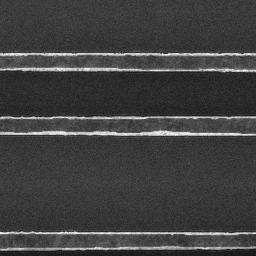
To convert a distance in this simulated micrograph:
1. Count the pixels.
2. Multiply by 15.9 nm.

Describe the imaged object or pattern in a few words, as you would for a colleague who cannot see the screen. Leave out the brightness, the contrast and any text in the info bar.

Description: lines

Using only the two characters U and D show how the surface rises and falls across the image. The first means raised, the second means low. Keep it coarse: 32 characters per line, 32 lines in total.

DDDDDDDDDDDDDDDDDDDDDDDDDDDDDDDD
DDDDDDDDDDDDDDDDDDDDDDDDDDDDDDDD
DDDDDDDDDDDDDDDDDDDDDDDDDDDDDDDD
DDDDDDDDDDDDDDDDDDDDDDDDDDDDDDDD
DDDDDDDDDDDDDDDDDDDDDDDDDDDDDDDD
DDDDDDDDDDDDDDDDDDDDDDDDDDDDDDDD
DDDDDDDDDDDDDDDDDDDDDDDDDDDDDDDD
UUUUUUUUUUUUUUUUUUUUUUUUUUUUUUUU
UUUUUUUUUUUUUUUUUUUUUUUUUUUUUUUU
DDDDDDDDDDDDDDDDDDDDDDDDDDDDDDDD
DDDDDDDDDDDDDDDDDDDDDDDDDDDDDDDD
DDDDDDDDDDDDDDDDDDDDDDDDDDDDDDDD
DDDDDDDDDDDDDDDDDDDDDDDDDDDDDDDD
DDDDDDDDDDDDDDDDDDDDDDDDDDDDDDDD
DDDDDDDDDDDDDDDDDDDDDDDDDDDDDDDD
UUUUUUUUUUUUUUUUUUUUUUUUUUUUUUUU
UUUUUUUUUUUUUUUUUUUUUUUUUUUUUUUU
DDDDDDDDDDDDDDDDDDDDDDDDDDDDDDDD
DDDDDDDDDDDDDDDDDDDDDDDDDDDDDDDD
DDDDDDDDDDDDDDDDDDDDDDDDDDDDDDDD
DDDDDDDDDDDDDDDDDDDDDDDDDDDDDDDD
DDDDDDDDDDDDDDDDDDDDDDDDDDDDDDDD
DDDDDDDDDDDDDDDDDDDDDDDDDDDDDDDD
DDDDDDDDDDDDDDDDDDDDDDDDDDDDDDDD
DDDDDDDDDDDDDDDDDDDDDDDDDDDDDDDD
DDDDDDDDDDDDDDDDDDDDDDDDDDDDDDDD
DDDDDDDDDDDDDDDDDDDDDDDDDDDDDDDD
DDDDDDDDDDDDDDDDDDDDDDDDDDDDDDDD
DDDDDDDDDDDDDDDDDDDDDDDDDDDDDDDD
UUUUUUUUUUUUUUUUUUUUUUUUUUUUUUUU
UUUUUUUUUUUUUUUUUUUUUUUUUUUUUUUU
DDDDDDDDDDDDDDDDDDDDDDDDDDDDDDDD